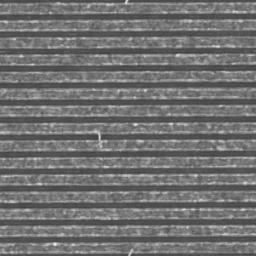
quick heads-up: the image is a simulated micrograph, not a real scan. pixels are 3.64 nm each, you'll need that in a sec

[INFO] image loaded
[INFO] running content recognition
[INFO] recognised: parallel lines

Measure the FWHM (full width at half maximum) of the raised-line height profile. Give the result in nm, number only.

37.8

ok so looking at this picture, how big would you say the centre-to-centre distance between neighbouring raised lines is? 62.4 nm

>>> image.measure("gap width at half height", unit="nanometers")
25.1